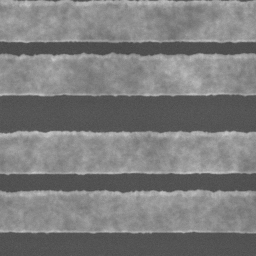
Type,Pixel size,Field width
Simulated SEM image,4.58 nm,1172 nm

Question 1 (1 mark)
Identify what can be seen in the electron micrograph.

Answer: lines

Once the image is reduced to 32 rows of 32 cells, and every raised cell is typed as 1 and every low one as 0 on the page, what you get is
11111111111111111111111111111111
11111111111111111111111111111111
11111111111111111111111111111111
11111111111111111111111111111111
11111111111111111111111111111111
00000000000000000000000000000000
00000000000000000000000000000000
11111111111111111111111111111111
11111111111111111111111111111111
11111111111111111111111111111111
11111111111111111111111111111111
11111111111111111111111111111111
00000000000000000000000000000000
00000000000000000000000000000000
00000000000000000000000000000000
00000000000000000000000000000000
00000001100000000000000010000000
11111111111111111111111111111111
11111111111111111111111111111111
11111111111111111111111111111111
11111111111111111111111111111111
11111111111111111111111111111111
00000000000000000000000000000000
00000000000000000000000000000000
11111111111111111111111111111111
11111111111111111111111111111111
11111111111111111111111111111111
11111111111111111111111111111111
11111111111111111111111111111111
00000000000000000000000000000000
00000000000000000000000000000000
00000000000000000000000000000000